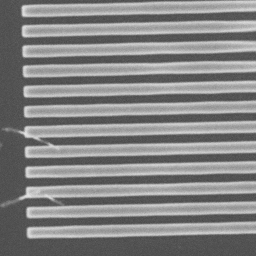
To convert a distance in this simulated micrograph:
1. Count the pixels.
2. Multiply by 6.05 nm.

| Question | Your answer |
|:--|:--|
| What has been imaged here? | groups of lines, slits or small figures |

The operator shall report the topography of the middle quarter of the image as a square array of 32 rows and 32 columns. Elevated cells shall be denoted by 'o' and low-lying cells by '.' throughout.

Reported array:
oooooooooooooooooooooooooooooooo
oooooooooooooooooooooooooooooooo
oooooooooooooooooo..............
................................
................................
oooooooooooooooooooooooooooooooo
oooooooooooooooooooooooooooooooo
oooooooooooooooooooooo..........
................................
................................
oooooooooooooooooooooooooooooooo
oooooooooooooooooooooooooooooooo
oooooooooooooooooooooooooo......
................................
................................
oooooooooooooooooooooooooooooooo
oooooooooooooooooooooooooooooooo
oooooooooooooooooooooooooo......
................................
................................
....oooooooooooooooooooooooooooo
oooooooooooooooooooooooooooooooo
ooooooooooooooooooooooo.........
................................
................................
......oooooooooooooooooooooooooo
oooooooooooooooooooooooooooooooo
oooooooooooooooooooooo..........
................................
................................
.........ooooooooooooooooooooooo
oooooooooooooooooooooooooooooooo